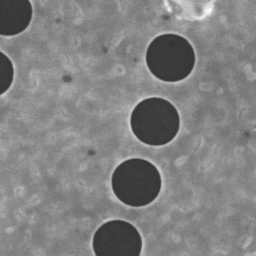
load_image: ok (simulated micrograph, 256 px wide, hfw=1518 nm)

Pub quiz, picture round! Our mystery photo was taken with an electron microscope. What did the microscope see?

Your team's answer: holes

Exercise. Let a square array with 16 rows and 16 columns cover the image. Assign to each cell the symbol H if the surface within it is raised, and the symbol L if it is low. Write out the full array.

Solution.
LLHHHHHHHHHHHHHH
LLHHHHHHHHHHHHHH
HHHHHHHHHHLLHHHH
HHHHHHHHHLLLHHHH
LHHHHHHHHLLLHHHH
LHHHHHHHHHHHHHHH
HHHHHHHHHLLHHHHH
HHHHHHHHLLLHHHHH
HHHHHHHHHLLHHHHH
HHHHHHHHHHHHHHHH
HHHHHHHLLLHHHHHH
HHHHHHHLLLHHHHHH
HHHHHHHHLLHHHHHH
HHHHHHHHHHHHHHHH
HHHHHHLLLHHHHHHH
HHHHHHLLLHHHHHHH